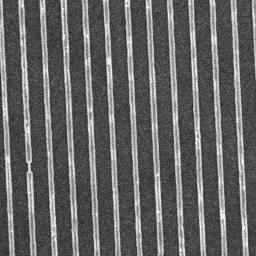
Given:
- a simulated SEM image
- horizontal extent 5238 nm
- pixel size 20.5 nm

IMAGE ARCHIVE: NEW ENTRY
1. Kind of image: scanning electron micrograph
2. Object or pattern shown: parallel lines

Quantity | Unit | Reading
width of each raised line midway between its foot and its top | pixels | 4.49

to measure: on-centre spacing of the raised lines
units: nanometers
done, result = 434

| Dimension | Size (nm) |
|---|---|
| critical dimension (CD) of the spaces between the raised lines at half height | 347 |